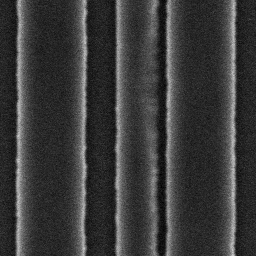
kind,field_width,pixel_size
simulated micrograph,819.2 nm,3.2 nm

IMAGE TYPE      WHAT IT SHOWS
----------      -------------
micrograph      lines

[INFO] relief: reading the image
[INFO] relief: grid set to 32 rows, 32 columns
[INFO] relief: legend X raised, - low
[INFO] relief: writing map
--XXXXXXXXX----XXXXX-XXXXXXXX---
--XXXXXXXXX----XXXX--XXXXXXXX---
--XXXXXXXXX----XXXXX-XXXXXXXX---
--XXXXXXXXX----XXXX--XXXXXXXX---
--XXXXXXXXX----XXXX--XXXXXXXX---
--XXXXXXXXX----XXXX--XXXXXXXX---
--XXXXXXXXX----XXXX--XXXXXXXX---
--XXXXXXXXX----XXXX--XXXXXXXX---
--XXXXXXXXX----XXXX--XXXXXXXX---
--XXXXXXXXX----XXXX--XXXXXXXX---
--XXXXXXXXX----XXXX--XXXXXXXX---
--XXXXXXXXX----XXXX--XXXXXXXX---
--XXXXXXXXX----XXXX--XXXXXXXX---
--XXXXXXXXX----XXXX--XXXXXXXX---
--XXXXXXXXX----XXXX--XXXXXXXX---
--XXXXXXXXX----XXXX--XXXXXXXX---
--XXXXXXXXX----XXXX--XXXXXXXX---
--XXXXXXXXX----XXXX--XXXXXXXX---
--XXXXXXXXX----XXXX--XXXXXXXX---
--XXXXXXXXX----XXXX--XXXXXXXX---
--XXXXXXXXX----XXXX--XXXXXXXX---
--XXXXXXXXX----XXXXX-XXXXXXXX---
--XXXXXXXXX----XXXX--XXXXXXXX---
--XXXXXXXXX----XXXX--XXXXXXXX---
--XXXXXXXXX----XXXX--XXXXXXXX---
--XXXXXXXXX----XXXX--XXXXXXXX---
--XXXXXXXXX----XXXXX-XXXXXXXX---
--XXXXXXXXX----XXXXX-XXXXXXXX---
--XXXXXXXXX----XXXXX-XXXXXXXX---
--XXXXXXXXX----XXXX--XXXXXXXX---
--XXXXXXXXX----XXXX--XXXXXXXX---
--XXXXXXXXX----XXXX--XXXXXXXX---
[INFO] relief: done